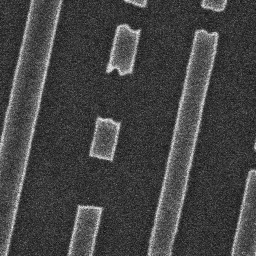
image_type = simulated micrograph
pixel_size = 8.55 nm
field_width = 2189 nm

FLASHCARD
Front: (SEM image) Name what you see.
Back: one or a few lines or trenches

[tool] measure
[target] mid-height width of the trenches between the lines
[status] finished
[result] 513 nm